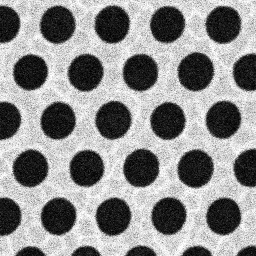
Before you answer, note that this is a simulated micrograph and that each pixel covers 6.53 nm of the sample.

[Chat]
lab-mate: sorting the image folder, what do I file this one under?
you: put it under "a regular array of holes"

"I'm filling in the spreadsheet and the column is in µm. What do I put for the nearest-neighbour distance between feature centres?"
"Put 0.357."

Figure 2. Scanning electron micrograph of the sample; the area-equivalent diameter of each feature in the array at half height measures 239 nm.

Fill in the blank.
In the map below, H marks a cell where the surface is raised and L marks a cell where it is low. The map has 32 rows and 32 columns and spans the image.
HHHHHHHHHHHHHHHHHHHHHHHHHHHHHHHH
LLHHHHLLLHHHLLLLHHHLLLLHHHLLLLHH
LLHHHLLLLHHHLLLLHHHLLLLHHHLLLLHH
LLHHHLLLLHHHLLLLHHHLLLLHHHLLLLHH
LLHHHLLLLHHHLLLLHHHLLLLHHHLLLLHH
HHHHHHHHHHHHHHHHHHHHHHHHHHHHHHHH
HHHHHHHHHHHHHHHHHHHHHHHHHHHHHHHH
HHLLLHHHHLLLHHHHLLLHHHHLLLHHHHLL
HHLLLLHHHLLLLHHLLLLLHHLLLLLHHLLL
HHLLLLHHLLLLLHHLLLLLHHLLLLLHHLLL
HHLLLHHHHLLLHHHHLLLHHHHLLLHHHHLL
HHHHHHHHHHHHHHHHHHHHHHHHHHHHHHHH
HHHHHHHHHHHHHHHHHHHHHHHHHHHHHHHH
LLHHHHLLLHHHLLLLHHHLLLLHHHLLLLHH
LLLHHLLLLHHHLLLLHHHLLLLHHHLLLLHH
LLLHHLLLLHHHLLLLHHHLLLLHHHLLLLHH
LLHHHLLLLHHHLLLLHHHLLLLHHHLLLLHH
HHHHHHHHHHHHHHHHHHHHHHHHHHHHHHHH
HHHHHHHHHHHHHHHHHHHHHHHHHHHHHHHH
HHLLLHHHHLLLHHHHLLLHHHHLLLHHHHLL
HHLLLLHHHLLLLHHHLLLLHHLLLLLHHLLL
HHLLLLHHHLLLLHHLLLLLHHLLLLLHHLLL
HHLLLHHHHLLLLHHHLLLHHHHLLLHHHHLL
HHHHHHHHHHHHHHHHHHHHHHHHHHHHHHHH
HHHHHHHHHHHHHHHHHHHHHHHHHHHHHHHH
LLHHHHLLLHHHHLLLHHHHLLLHHHLLLLHH
LLLHHLLLLHHHLLLLHHHLLLLHHHLLLLHH
LLLHHLLLLHHHLLLLHHHLLLLHHHLLLLHH
LLHHHHLLLHHHLLLLHHHLLLLHHHLLLLHH
HHHHHHHHHHHHHHHHHHHHHHHHHHHHHHHH
HHHHHHHHHHHHHHHHHHHHHHHHHHHHHHHH
HHLLLHHHHLLLHHHHLLLHHHHLLLHHHHLL